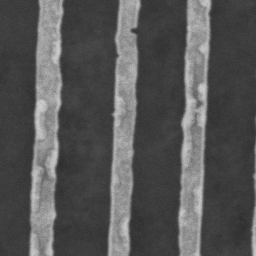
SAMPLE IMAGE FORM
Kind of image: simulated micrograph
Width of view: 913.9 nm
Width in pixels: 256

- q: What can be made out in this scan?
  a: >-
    one or a few lines or trenches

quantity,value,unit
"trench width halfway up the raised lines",0.194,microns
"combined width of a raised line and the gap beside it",264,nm